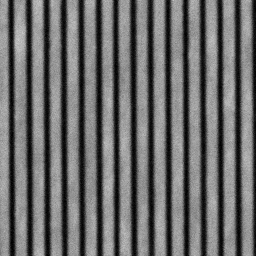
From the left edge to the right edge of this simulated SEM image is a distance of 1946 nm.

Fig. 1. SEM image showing parallel lines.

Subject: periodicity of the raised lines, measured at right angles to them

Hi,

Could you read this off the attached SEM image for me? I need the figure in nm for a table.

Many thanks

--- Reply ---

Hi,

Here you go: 132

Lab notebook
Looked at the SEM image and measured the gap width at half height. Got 0.0446 microns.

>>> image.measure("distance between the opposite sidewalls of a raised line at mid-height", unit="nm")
89.3